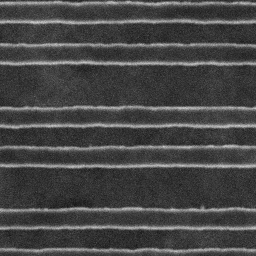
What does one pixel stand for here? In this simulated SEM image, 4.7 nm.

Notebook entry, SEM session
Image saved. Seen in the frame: lines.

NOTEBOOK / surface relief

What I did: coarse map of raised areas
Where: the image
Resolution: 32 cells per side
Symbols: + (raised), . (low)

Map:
++++++++++++++++++++++++++++++++
++++++++++++++++++++++++++++++++
++++++++++++++++++++++++++++++++
................................
................................
................................
++++++++++++++++++++++++++++++++
++++++++++++++++++++++++++++++++
................................
................................
................................
................................
................................
++.++...++++++++++++++++++++++++
++++++++++++++++++++++++++++++++
++++++++++++++++++++++++++++++++
................................
................................
+++++++.+..+++++++++++++++++++++
++++++++++++++++++++++++++++++++
++++++++++++++++++++++++++++++++
................................
................................
................................
................................
................................
++++++++++++++++++++++++++++++++
++++++++++++++++++++++++++++++++
+++++++++++++.++++++++++++++++++
................................
................................
++++++++++++++++++++++++++++++++